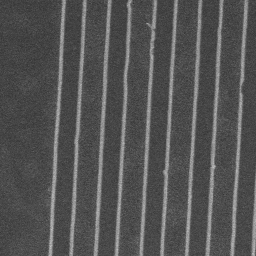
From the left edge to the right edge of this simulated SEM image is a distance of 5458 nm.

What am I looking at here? parallel lines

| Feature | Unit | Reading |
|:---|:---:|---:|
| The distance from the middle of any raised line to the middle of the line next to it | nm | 969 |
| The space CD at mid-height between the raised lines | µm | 0.519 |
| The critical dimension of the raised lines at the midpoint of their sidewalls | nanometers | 458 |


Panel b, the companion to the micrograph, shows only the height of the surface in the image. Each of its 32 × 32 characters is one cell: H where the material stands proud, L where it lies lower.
LLLLLLLLHHHLLLHHLLLHHHLLLHHHLLLH
LLLLLLLLHHLLLLHHLLLHHHLLLHHHLLLH
LLLLLLLLHHLLLLHHLLLHHHLLLHHHLLLH
LLLLLLLLHHLLLLHHLLLHHHLLLHHHLLLH
LLLLLLLLHHLLLHHHLLLHHHLLLHHLLLHH
LLLLLLLLHHLLLHHHLLLHHHLLLHHLLLHH
LLLLLLLLHHLLLHHHLLLHHHLLLHHLLLHH
LLLLLLLLHHLLLHHHLLLHHHLLLHHLLLHH
LLLLLLLLHHLLLHHHLLLHHHLLLHHLLLHH
LLLLLLLLHHLLLHHHLLLHHLLLLHHLLLHH
LLLLLLLHHHLLLHHHLLLHHLLLLHHLLLHH
LLLLLLLHHHLLLHHHLLLHHLLLHHHLLLHH
LLLLLLLHHHLLLHHHLLLHHLLLHHHLLLHH
LLLLLLLHHHLLLHHHLLLHHLLLHHHLLLHH
LLLLLLLHHHLLLHHHLLLHHLLLHHHLLLHH
LLLLLLLHHHLLLHHLLLHHHLLLHHHLLLHH
LLLLLLLHHHLLLHHLLLHHHLLLHHHLLLHH
LLLLLLLHHHLLLHHLLLHHHLLLHHHLLLHH
LLLLLLLHHHLLLHHLLLHHHLLLHHHLLLHH
LLLLLLLHHHLLLHHLLLHHHLLLHHHLLLHH
LLLLLLLHHLLLLHHLLLHHHLLLHHHLLLHH
LLLLLLLHHLLLLHHLLLHHHLLLHHHLLLHH
LLLLLLLHHLLLHHHLLLHHHLLLHHLLLLHH
LLLLLLLHHLLLHHHLLLHHHLLLHHLLLHHH
LLLLLLLHHLLLHHHLLLHHHLLLHHLLLHHH
LLLLLLLHHLLLHHHLLLHHHLLLHHLLLHHH
LLLLLLLHHLLLHHHLLLHHHLLLHHLLLHHH
LLLLLLHHHLLLHHHLLLHHLLLLHHLLLHHH
LLLLLLLHHLLLHHHLLLHHLLLLHHLLLHHH
LLLLLLHHHLLLHHHLLLHHLLLHHHLLLHHH
LLLLLLHHHLLLHHHLLLHHLLLHHHLLLHHH
LLLLLLHHHLLLHHHLLLHHLLLHHHLLLHHH